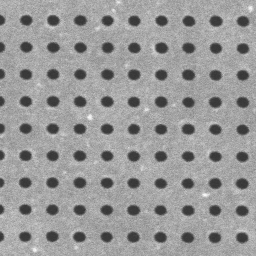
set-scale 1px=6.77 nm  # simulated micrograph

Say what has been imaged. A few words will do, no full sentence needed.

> a regular array of holes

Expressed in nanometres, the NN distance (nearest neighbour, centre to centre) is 182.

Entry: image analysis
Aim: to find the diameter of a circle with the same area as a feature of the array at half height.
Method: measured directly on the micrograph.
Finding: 0.0823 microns